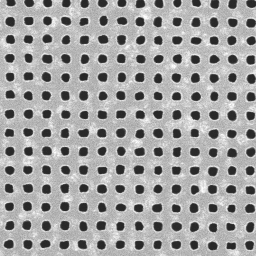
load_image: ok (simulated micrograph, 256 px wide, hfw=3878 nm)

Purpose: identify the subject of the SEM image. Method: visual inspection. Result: a regular array of holes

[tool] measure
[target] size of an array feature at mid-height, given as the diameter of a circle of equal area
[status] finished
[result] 142 nm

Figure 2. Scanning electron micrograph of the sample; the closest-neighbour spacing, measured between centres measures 273 nm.